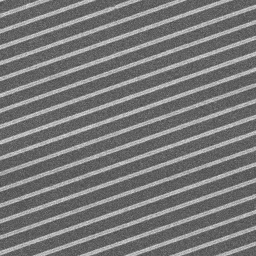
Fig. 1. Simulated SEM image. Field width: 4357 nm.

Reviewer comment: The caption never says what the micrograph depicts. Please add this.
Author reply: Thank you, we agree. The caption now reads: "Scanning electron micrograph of parallel lines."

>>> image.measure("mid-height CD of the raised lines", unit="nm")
46.2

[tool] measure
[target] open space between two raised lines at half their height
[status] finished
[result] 203 nm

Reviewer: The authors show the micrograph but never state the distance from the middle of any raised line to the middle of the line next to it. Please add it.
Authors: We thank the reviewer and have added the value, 254 nanometers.